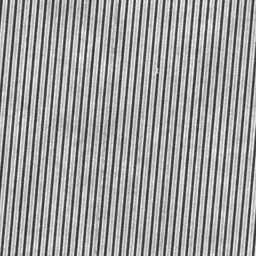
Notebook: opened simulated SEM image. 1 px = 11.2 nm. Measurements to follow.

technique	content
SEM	parallel lines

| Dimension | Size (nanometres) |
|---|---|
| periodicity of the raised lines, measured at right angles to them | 82.3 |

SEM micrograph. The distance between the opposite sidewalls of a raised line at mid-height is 50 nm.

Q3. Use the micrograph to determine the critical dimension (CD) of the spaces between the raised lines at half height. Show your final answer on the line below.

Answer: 38.9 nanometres